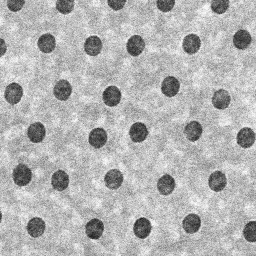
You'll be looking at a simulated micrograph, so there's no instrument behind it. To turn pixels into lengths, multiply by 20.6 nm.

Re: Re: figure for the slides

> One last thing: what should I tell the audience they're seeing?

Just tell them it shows a regular array of holes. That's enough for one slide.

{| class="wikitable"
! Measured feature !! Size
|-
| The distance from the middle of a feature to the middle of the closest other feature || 934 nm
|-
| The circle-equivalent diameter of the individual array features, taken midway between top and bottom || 426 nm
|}